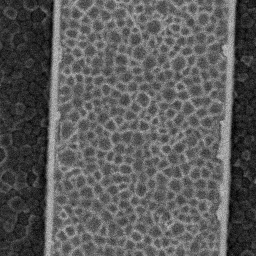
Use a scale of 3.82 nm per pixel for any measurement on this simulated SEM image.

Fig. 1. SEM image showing one or a few lines or trenches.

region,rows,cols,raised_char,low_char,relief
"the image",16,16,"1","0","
0000111111111100
0000111111111100
0000111111111100
0001111111111100
0001111111111100
0001111111111100
0001111111111100
0001111111111100
0001111111111100
0001111111111100
0001111111111100
0001111111111100
0001111111111100
0001111111111100
0001111111111100
0001111111111100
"